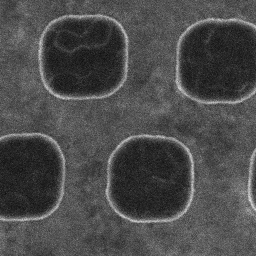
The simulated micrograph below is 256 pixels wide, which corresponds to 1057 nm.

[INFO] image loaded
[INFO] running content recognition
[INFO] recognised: raised bodies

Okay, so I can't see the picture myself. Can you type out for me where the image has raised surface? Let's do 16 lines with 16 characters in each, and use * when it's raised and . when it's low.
................
...****.....****
...*****...*****
..******...*****
...*****...*****
...****....*****
................
................
***......*......
****...*****....
****...*****....
****...*****....
****...*****....
***.....***.....
................
................